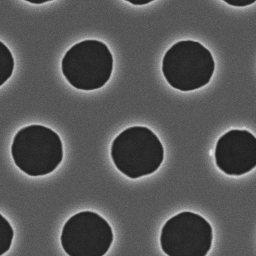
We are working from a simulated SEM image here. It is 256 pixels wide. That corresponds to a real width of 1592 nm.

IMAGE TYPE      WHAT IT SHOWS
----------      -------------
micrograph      holes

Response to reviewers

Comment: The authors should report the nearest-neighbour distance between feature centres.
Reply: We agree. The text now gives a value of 620 nanometers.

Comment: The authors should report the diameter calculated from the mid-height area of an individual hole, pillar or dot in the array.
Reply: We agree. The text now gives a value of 0.318 micrometres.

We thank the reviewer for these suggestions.